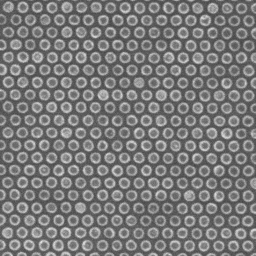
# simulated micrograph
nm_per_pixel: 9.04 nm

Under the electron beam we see a regular array of raised bodies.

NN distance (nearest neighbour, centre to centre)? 128 nm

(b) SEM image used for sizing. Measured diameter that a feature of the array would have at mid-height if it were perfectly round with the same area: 9.58 px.